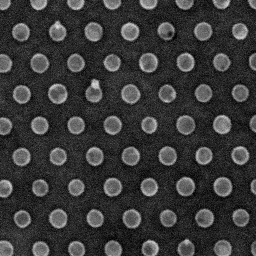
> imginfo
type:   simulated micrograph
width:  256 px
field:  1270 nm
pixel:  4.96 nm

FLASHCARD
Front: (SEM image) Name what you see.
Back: a regular array of raised bodies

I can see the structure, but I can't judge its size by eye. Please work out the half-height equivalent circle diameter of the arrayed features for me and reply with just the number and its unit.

0.0845 um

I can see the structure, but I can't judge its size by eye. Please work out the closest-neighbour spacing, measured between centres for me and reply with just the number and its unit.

0.177 um